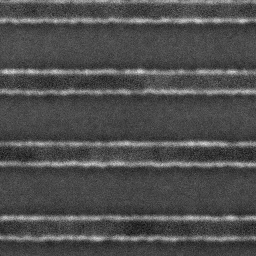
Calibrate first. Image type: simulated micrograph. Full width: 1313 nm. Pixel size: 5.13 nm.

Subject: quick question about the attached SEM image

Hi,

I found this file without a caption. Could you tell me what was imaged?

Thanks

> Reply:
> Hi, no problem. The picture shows lines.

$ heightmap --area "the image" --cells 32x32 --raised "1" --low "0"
11111111111111111111111111111111
11111111111111111111111111111111
11111111111111111111111111111111
00000000000000000000000000000000
00000000000000000000000000000000
00000000000000000000000000000000
00000000000000000000000000000000
00000000000000000000000000000000
00000000000000000000000000000000
11111111111111111111111111111111
11111111111111111111111111111111
11111111111111111111111111111111
00000000000000000000000000000000
00000000000000000000000000000000
00000000000000000000000000000000
00000000000000000000000000000000
00000000000000000000000000000000
00000000000000000000000000000000
11111111111111111111111111111111
11111111111111111111111111111111
11111111111111111111111111111111
00000000000000000000000000000000
00000000000000000000000000000000
00000000000000000000000000000000
00000000000000000000000000000000
00000000000000000000000000000000
00000000000000000000000000000000
11111111111111111111111111111111
11111111111111111111111111111111
11111111111111111111111111111111
00000000000000000000000000000000
00000000000000000000000000000000